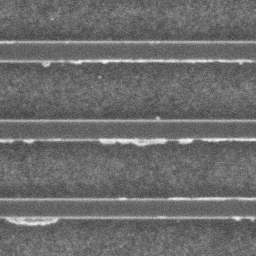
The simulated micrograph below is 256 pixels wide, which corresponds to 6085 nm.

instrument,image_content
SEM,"lines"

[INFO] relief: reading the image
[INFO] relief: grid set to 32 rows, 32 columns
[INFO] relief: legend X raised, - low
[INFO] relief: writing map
--------------------------------
--------------------------------
--------------------------------
--------------------------------
--------------------------------
XXXXXXXXXXXXXXXXXXXXXXXXXXXXXXXX
XXXXXXXXXXXXXXXXXXXXXXXXXXXXXXXX
XXXXXXXXXXXXXXXXXXXXXXXXXXXXXXXX
--------------------------------
--------------------------------
--------------------------------
--------------------------------
--------------------------------
--------------------------------
--------------------------------
XXXXXXXXXXXXXXXXXXXXXXXXXXXXXXXX
XXXXXXXXXXXXXXXXXXXXXXXXXXXXXXXX
--------------------------------
--------------------------------
--------------------------------
--------------------------------
--------------------------------
--------------------------------
--------------------------------
--------------------------------
XXXXXXXXXXXXXXXXXXXXXXXXXXXXXXXX
XXXXXXXXXXXXXXXXXXXXXXXXXXXXXXXX
--------------------------------
--------------------------------
--------------------------------
--------------------------------
--------------------------------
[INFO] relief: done